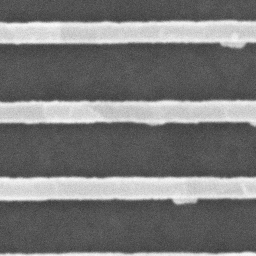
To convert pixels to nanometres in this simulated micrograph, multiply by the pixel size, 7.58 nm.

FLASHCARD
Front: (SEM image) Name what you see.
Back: lines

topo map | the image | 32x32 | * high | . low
................................
................................
................................
********************************
********************************
................................
................................
................................
................................
................................
................................
................................
................................
********************************
********************************
................................
................................
................................
................................
................................
................................
................................
********************************
********************************
********************************
................................
................................
................................
................................
................................
................................
................................